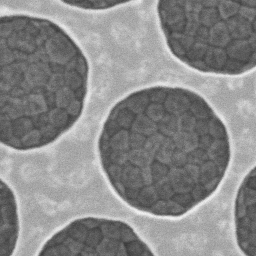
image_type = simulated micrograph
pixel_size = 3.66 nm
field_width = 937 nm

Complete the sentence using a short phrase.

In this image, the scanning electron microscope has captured holes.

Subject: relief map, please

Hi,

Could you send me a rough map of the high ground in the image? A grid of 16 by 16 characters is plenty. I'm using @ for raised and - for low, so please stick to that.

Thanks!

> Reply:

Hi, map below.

@@@@@--@@@------
---@@@@@@@------
-----@@@@@------
-----@@@@@@-----
------@@@@@@@--@
-----@@@@--@@@@@
-----@@------@@@
-----@@-------@@
----@@--------@@
@@@@@@--------@@
@@@@@@--------@@
@@@@@@@-------@-
-@@@@@@@-----@@-
-@@@@@@@@@@@@@@-
-@@@----@@@@@@@-
-@@------@@@@@@-